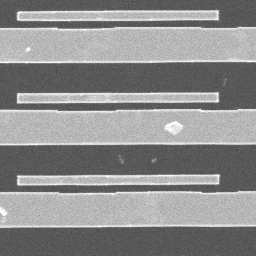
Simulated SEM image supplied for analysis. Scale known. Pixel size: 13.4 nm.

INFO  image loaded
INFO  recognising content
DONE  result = wiring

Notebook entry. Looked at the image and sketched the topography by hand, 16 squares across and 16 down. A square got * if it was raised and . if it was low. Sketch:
................
..**...******...
****************
****************
................
................
.***.....****...
****************
****************
................
................
.******..***....
****************
****************
................
................